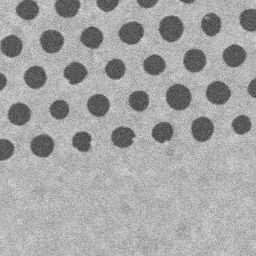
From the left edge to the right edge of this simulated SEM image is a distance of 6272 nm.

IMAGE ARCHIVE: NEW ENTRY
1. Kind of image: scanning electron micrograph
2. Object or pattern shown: a regular array of holes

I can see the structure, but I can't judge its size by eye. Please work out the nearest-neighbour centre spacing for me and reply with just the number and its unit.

961 nanometres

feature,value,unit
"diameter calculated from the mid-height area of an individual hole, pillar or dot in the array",588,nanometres